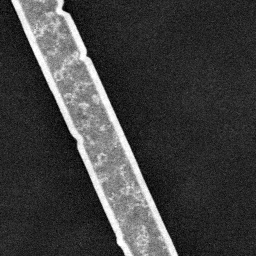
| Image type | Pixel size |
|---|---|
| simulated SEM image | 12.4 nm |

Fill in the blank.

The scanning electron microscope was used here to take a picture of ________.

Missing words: one or a few lines or trenches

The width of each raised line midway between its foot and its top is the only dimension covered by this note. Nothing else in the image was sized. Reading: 524 nanometres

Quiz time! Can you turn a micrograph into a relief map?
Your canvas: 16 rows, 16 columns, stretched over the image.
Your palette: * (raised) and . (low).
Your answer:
.***............
..**............
..***...........
..***...........
...***..........
...***..........
....***.........
....***.........
.....***........
.....***........
......**........
......***.......
......***.......
.......***......
.......***......
........***.....